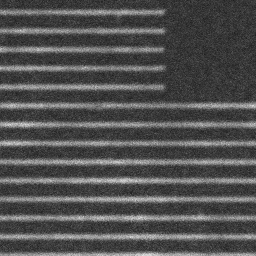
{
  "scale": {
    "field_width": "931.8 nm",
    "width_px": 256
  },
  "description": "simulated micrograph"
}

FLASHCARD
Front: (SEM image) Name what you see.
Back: parallel lines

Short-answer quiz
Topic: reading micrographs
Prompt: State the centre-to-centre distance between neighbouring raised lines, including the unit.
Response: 68.2 nanometers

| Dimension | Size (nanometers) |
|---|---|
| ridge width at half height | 14.6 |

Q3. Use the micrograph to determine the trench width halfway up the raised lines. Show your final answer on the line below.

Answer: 51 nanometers